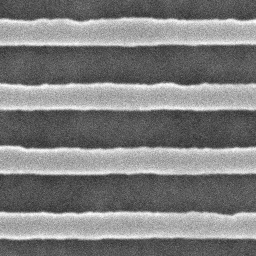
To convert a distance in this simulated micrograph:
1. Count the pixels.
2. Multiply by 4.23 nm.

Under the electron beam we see lines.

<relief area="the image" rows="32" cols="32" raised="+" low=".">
................................
................................
+....+........++++++............
++++++++++++++++++++++++++++++++
++++++++++++++++++++++++++++++++
++..+..+++...+++++..............
................................
................................
................................
................................
.............+..................
++++++++++++++++++++++++++++++++
++++++++++++++++++++++++++++++++
+++++++..+++++++++++.+++++++...+
................................
................................
................................
................................
+++.............................
++++++++++++++++++++++++++++++++
++++++++++++++++++++++++++++++++
+++.++++++++++.++..++++++++.+.+.
................................
................................
................................
................................
................................
++++++++++++++++++++++++++++++++
++++++++++++++++++++++++++++++++
++++++++++++++++++++++++++++++++
................................
................................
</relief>